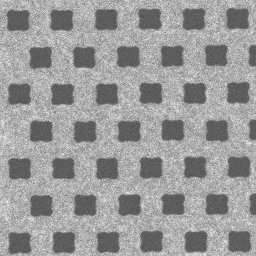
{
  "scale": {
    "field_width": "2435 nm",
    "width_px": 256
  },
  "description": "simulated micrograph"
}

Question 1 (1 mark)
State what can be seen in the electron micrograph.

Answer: a regular array of holes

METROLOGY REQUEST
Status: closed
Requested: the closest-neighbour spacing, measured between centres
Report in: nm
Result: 406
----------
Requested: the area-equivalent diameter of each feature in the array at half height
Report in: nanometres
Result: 228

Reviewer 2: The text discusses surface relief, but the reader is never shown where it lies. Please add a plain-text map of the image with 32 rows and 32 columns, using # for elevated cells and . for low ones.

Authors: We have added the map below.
################################
#..###...###...##...###...##...#
#...##...###...##...###...##...#
#...##...###...###..###..####..#
################################
################################
####..###...###..###...###..###.
####..###...###..###...###..###.
####..####.#####################
################################
#######..###..####..###..####..#
#...##...###...###..###...##...#
#...##...###...###..###...##...#
################################
################################
####...##...###..###...###..###.
####...##...###...##...###..###.
####..###...###..####..###..####
################################
################################
#...###..###...##...###...###..#
#...###..###...##...###...###..#
################################
################################
####..###...###..###...###..###.
####...##...###...##...###..###.
####...##...###...##...###..###.
################################
################################
#...###..###...###..###...###..#
#...###..###...###..###...##...#
#...###..###...#########..######